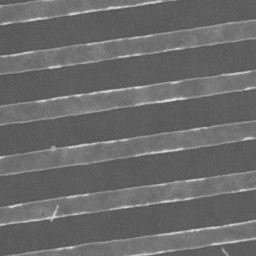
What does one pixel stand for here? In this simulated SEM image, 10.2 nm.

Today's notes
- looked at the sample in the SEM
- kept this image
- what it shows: parallel lines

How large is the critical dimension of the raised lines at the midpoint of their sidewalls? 0.192 µm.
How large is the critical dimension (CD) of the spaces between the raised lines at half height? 0.313 um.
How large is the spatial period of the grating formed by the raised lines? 0.503 um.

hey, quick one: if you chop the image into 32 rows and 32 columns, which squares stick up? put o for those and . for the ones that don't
..oooooooooooooooo..............
ooooooooooo.....................
ooooo...........................
.........................ooooooo
..................oooooooooooooo
...........oooooooooooooooo.....
...ooooooooooooooooo............
ooooooooooooo...................
ooooooo.........................
...........................ooooo
....................oooooooooooo
............ooooooooooooooooo...
.....ooooooooooooooooo..........
ooooooooooooooo.................
oooooooo........................
o............................ooo
........................oooooooo
...............oooooooooooooooo.
......oooooooooooooooooo........
.oooooooooooooooo...............
ooooooooooo.....................
ooo............................o
........................oooooooo
................oooooooooooooooo
.........ooooooooooooooooo......
..ooooooooooooooooo.............
oooooooooooo....................
ooooo...........................
..........................oooooo
...................ooooooooooooo
...........ooooooooooooooooo....
....ooooooooooooooooo...........